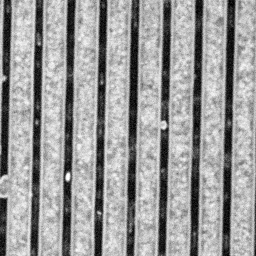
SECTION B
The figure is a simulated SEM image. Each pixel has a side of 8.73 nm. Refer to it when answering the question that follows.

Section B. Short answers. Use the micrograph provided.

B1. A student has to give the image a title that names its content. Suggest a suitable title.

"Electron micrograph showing parallel lines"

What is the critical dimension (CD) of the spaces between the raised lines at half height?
0.0917 microns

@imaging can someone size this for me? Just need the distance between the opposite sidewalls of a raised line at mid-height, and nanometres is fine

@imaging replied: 191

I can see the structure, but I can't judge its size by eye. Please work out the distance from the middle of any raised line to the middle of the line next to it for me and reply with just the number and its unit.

279 nm